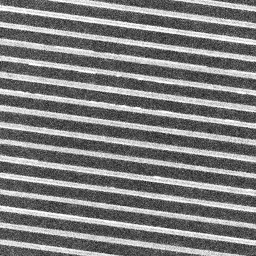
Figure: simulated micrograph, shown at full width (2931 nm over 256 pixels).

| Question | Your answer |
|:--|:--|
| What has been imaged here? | parallel lines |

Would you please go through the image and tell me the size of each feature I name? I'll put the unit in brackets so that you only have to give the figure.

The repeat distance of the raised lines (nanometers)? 190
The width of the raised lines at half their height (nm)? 44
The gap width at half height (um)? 0.139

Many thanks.